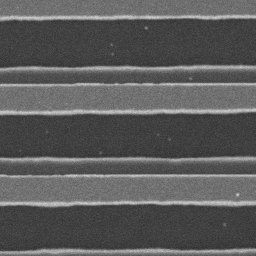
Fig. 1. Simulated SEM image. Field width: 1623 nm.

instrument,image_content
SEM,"lines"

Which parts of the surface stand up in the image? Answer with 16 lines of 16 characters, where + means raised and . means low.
++++++++++++++++
................
................
................
................
++++++++++++++++
++++++++++++++++
................
................
................
................
++++++++++++++++
++++++++++++++++
................
................
................